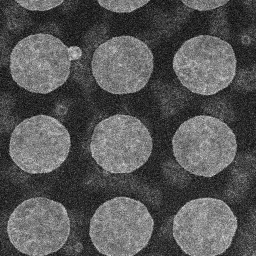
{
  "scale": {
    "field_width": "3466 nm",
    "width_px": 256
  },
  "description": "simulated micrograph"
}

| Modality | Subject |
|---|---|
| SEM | raised bodies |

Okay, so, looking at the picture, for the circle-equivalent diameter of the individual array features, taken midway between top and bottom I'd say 810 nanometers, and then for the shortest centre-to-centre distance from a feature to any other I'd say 1090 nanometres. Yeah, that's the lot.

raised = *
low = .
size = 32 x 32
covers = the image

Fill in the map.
...****......*****.....*****....
................................
................................
................................
....**..........................
..******.....*****.....*****....
..********..*******...*******...
.********...*******...*******...
.********...*******...*******...
..*******...*******...*******...
..******....******.....******...
.....*........***.......***.....
................................
.......*........................
.....*........**................
...*****....******.....*****....
..******....******....*******...
.********..********...*******...
.********..********...********..
.*******....*******...*******...
..******....******.....******...
...***.......***........***.....
................................
................................
................................
...****......*****.....*****....
..******....*******...*******...
.********..********...********..
.********..********...********..
.*******...********...*******...
..******....******....*******...
...****......****......*****....